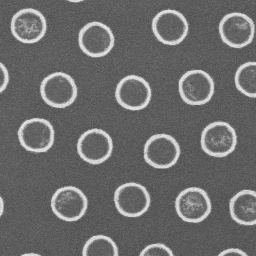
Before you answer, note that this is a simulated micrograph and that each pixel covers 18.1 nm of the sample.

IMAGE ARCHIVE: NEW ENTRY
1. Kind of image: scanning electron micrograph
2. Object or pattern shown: a regular array of raised bodies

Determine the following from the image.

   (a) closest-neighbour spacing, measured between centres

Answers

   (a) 1100 nm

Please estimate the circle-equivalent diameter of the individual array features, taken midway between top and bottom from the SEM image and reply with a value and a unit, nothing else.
579 nm